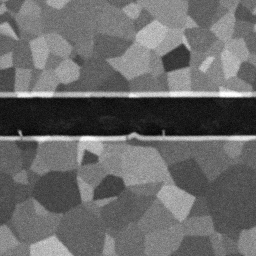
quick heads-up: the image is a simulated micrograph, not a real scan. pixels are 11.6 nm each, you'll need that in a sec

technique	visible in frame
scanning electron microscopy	one or a few lines or trenches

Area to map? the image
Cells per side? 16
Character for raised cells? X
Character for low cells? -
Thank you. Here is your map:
XXXXXXXXXXXXXXXX
XXXXXXXXXXXXXXXX
XXXXXXXXXXXXXXXX
XXXXXXXXXXXXXXXX
XXXXXXXXXXXXXXXX
XXXXXXXXXXXXXXXX
----------------
----------------
----------------
XXXXXXXXXXXXXXXX
XXXXXXXXXXXXXXXX
XXXXXXXXXXXXXXXX
XXXXXXXXXXXXXXXX
XXXXXXXXXXXXXXXX
XXXXXXXXXXXXXXXX
XXXXXXXXXXXXXXXX